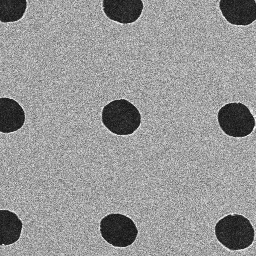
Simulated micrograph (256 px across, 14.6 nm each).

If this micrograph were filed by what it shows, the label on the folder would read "holes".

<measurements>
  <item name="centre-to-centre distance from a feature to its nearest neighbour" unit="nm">1640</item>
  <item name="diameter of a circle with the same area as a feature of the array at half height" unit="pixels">36.5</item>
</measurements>